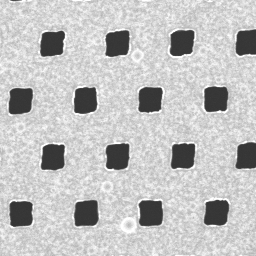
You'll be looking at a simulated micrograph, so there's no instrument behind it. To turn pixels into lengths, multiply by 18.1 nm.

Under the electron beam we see a regular array of holes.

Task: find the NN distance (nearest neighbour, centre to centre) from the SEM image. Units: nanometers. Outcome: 1170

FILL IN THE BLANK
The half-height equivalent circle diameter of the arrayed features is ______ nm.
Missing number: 483